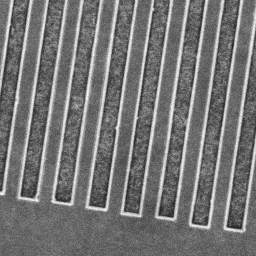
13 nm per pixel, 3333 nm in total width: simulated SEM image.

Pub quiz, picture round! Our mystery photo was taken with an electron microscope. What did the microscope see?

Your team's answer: parallel lines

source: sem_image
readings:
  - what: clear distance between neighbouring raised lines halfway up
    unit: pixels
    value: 17.8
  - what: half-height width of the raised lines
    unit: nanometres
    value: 219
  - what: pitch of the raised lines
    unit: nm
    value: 452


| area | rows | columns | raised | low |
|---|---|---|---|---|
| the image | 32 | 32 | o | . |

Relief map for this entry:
o...oo..oo..ooo..oo..oo...oo..oo
o...oo..oo..ooo..oo..oo...oo..oo
o..ooo..oo..oo...oo..oo..ooo..oo
o..ooo..oo..oo...oo..oo..oo...oo
o..oo...oo..oo..ooo..oo..oo..ooo
o..oo...oo..oo..oo...oo..oo..oo.
o..oo..oo...oo..oo..ooo..oo..oo.
o..oo..oo..ooo..oo..oo...oo..oo.
...oo..oo..ooo..oo..oo...oo..oo.
..ooo..oo..oo...oo..oo..ooo..oo.
..ooo..oo..oo...oo..oo..ooo..oo.
..oo...oo..oo..oo...oo..oo..ooo.
..oo..ooo..oo..oo...oo..oo..oo..
..oo..oo...oo..oo..ooo..oo..oo..
..oo..oo..ooo..oo..oo...oo..oo..
..oo..oo..ooo..oo..oo...oo..oo..
.ooo..oo..oo...oo..oo..ooo..oo..
.ooo..oo..oo..ooo..oo..oo...oo..
.oo..ooo..oo..oo...oo..oo..ooo..
.oo..oo...oo..oo...oo..oo..oo...
.oo..oo...oo..oo..ooo..oo..oo...
.oo..oo..ooo..oo..ooo..oo..oo..o
.oo..oo..ooo..oo..oo...oo..oo..o
ooo..oo..oo...oo..oo..oo...oo..o
ooo.ooo..oo..ooo..oo..oo...oo..o
ooooooooooo..oo...oo..oo..ooo..o
oooooooooooooooo..oo..oo..oo...o
oooooooooooooooooooooooo..oo...o
ooooooooooooooooooooooooooooo.oo
oooooooooooooooooooooooooooooooo
oooooooooooooooooooooooooooooooo
oooooooooooooooooooooooooooooooo